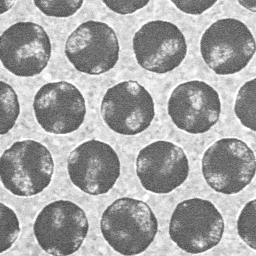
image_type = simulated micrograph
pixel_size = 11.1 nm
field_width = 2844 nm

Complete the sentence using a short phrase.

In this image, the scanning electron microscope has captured a regular array of holes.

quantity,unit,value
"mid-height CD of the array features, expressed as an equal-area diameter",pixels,54.4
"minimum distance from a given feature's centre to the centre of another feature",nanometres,747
